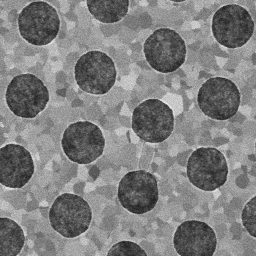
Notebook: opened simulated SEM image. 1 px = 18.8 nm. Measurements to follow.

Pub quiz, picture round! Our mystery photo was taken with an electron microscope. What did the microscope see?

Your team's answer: a regular array of holes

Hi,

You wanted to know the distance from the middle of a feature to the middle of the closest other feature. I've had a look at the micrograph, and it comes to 1350 nanometres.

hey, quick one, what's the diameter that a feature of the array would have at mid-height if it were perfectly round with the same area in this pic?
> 825 nm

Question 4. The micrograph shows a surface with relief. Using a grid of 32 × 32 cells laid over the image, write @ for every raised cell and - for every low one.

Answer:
@@@@--@@@@@-----@@@@@@@@@@@@@@@@
@@@----@@@@-----@@@@@@@@@@@----@
@@------@@@@---@@@@@@@@@@@@-----
@@-----@@@@@@@@@@@@@@@@@@@------
@@@----@@@@@@@@@@@@----@@@@----@
@@@@--@@@@@@@@@@@@-----@@@@----@
@@@@@@@@@@@--@@@@@-----@@@@@@@@@
@@@@@@@@@@----@@@@-----@@@@@@@@@
@@@@@@@@@-----@@@@@---@@@@@@@@@@
@@--@@@@@------@@@@@@@@@@@@@@@@@
@----@@@@@----@@@@@@@@@@@----@@@
@-----@@@@@--@@@@@@@@@@@@-----@@
@-----@@@@@@@@@@@@--@@@@@-----@@
@-----@@@@@@@@@@@----@@@@-----@@
@@--@@@@@@@@@@@@------@@@@---@@@
@@@@@@@@@---@@@@------@@@@@@@@@@
@@@@@@@@-----@@@@-----@@@@@@@@@@
@@@@@@@@-----@@@@@---@@@@@@@@@@@
---@@@@@-----@@@@@-@@@@@@--@@@@@
----@@@@-----@@@@@-@@@@@----@@@@
----@@@@@@-@@@@@@--@@@@-----@@@@
----@@@@@@@@@@@@---@@@@------@@@
----@@@@@@@@@@@-----@@@@----@@@@
@-@@@@@@@@@@@@@-----@@@@@--@@@@@
@@@@@@@---@@@@@-----@@@@@@@@@@@@
@@@@@@-----@@@@----@@@@@@@@@@@@-
@@@@@@-----@@@@@--@@@@@@@@@@@@--
--@@@@-----@@@@@@@@@@@@@@@@@@@--
---@@@@----@@@@@@@@@@@----@@@@@-
---@@@@@--@@@@@@@@@@@@-----@@@@-
---@@@@@@@@@@@---@@@@@-----@@@@@
---@@@@@@@@@@-----@@@@-----@@@@@